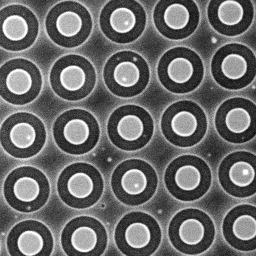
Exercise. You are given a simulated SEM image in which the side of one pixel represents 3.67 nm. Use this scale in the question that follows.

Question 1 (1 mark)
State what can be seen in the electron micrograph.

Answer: an array of small figures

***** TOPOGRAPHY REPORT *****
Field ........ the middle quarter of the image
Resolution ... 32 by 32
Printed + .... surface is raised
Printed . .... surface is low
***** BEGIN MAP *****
.......+++...+++++...++...++++++
++++....++...+++++...++...++++++
+++++...++...++++++..++...++++++
+++++...++...++++++..+++...++++.
+++++...++...+++++...+++....++..
++++....+++....+.....++++.......
.......++++.........++++++......
......++++++.......+++++++++.+++
.....+++++++++++++++++++++++++++
++++++++++++++++++++++++++++....
++++++++++++++.....+++++++......
+....++++++++.......+++++.......
.......+++++.........++++....+++
........+++....+++....++....++++
.++++...+++...+++++...++...+++++
++++++...++...+++++....+...+++++
++++++...++...+++++...++....++++
++++++...++...+++++...+++....+++
.+++++...++....+++....+++.......
..+++...++++.........+++++......
........+++++.......++++++++....
.......++++++++...++++++++++++++
++...+++++++++++++++++++++++++++
++++++++++++++++++++++++++++....
++++.+++++++++.......++++++.....
+......++++++.........++++......
........+++++..........++....+++
...++....+++...+++++...++...++++
..++++....++...+++++...++...++++
.++++++...++...+++++....+...++++
.++++++...++...+++++...++....+++
.++++++...++...+++++...+++......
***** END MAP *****